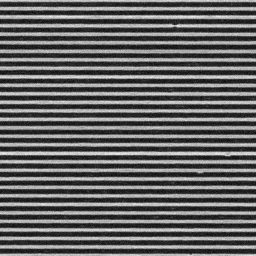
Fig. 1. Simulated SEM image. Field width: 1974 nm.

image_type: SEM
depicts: parallel lines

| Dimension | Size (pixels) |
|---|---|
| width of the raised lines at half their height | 3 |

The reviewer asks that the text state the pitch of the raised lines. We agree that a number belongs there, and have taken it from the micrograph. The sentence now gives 0.0655 µm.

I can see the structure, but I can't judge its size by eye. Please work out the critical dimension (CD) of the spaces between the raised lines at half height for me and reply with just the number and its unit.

45.3 nm